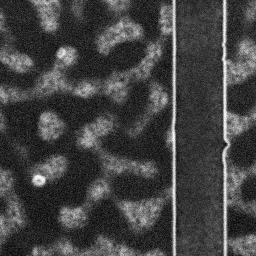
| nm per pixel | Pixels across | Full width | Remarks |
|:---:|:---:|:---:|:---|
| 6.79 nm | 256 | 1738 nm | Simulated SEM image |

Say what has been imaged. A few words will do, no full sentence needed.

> one or a few lines or trenches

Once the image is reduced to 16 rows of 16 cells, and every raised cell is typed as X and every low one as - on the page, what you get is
XXXXXXXXXXX---XX
XXXXXXXXXXX---XX
XXXXXXXXXXX---XX
XXXXXXXXXXX---XX
XXXXXXXXXXX---XX
XXXXXXXXXXX---XX
XXXXXXXXXXX---XX
XXXXXXXXXXX---XX
XXXXXXXXXXX---XX
XXXXXXXXXXX---XX
XXXXXXXXXXX---XX
XXXXXXXXXXX---XX
XXXXXXXXXXX---XX
XXXXXXXXXXX---XX
XXXXXXXXXXX---XX
XXXXXXXXXXX---XX